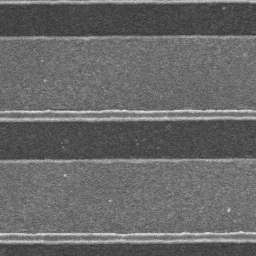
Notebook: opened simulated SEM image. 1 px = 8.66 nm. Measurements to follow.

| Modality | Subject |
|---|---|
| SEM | lines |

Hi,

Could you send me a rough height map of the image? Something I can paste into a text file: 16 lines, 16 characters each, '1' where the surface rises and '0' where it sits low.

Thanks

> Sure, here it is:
0000000000000000
0000000000000000
1111111111111111
1111111111111111
1111111111111111
1111111111111111
1111111111111111
0000000000000000
0000000000000000
0000000000000000
1111111111111111
1111111111111111
1111111111111111
1111111111111111
1111111111111111
0000000000000000